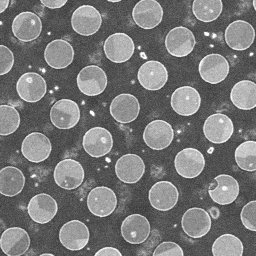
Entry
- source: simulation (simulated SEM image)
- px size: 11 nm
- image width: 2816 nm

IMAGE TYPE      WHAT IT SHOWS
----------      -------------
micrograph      a regular array of raised bodies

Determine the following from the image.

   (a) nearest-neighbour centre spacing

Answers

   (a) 464 nm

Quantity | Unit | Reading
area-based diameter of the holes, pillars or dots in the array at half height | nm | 323